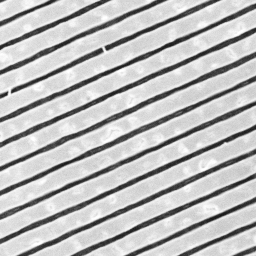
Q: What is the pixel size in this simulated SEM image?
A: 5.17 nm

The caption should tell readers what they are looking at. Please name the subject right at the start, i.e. parallel lines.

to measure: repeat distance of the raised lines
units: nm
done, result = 114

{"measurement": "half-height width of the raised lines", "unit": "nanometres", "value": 87.3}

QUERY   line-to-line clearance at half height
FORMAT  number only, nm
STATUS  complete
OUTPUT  28.9